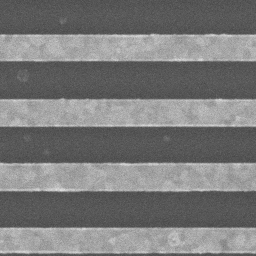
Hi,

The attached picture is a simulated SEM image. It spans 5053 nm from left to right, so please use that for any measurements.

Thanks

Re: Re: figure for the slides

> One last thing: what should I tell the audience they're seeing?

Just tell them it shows lines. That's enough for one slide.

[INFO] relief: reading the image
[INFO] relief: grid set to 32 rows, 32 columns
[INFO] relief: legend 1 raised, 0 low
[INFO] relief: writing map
00000000000000000000000000000000
00000000000000000000000000000000
00000000000000000000000000000000
00000000000000000000000000000000
11111111111111111111111111111111
11111111111111111111111111111111
11111111111111111111111111111111
11111111111111111111111111111111
00000000000000000000000000000000
00000000000000000000000000000000
00000000000000000000000000000000
00000000000000000000000000000000
00000001000000000000000000000000
11111111111111111111111111111111
11111111111111111111111111111111
11111111111111111111111111111111
00000000000000000000000000000000
00000000000000000000000000000000
00000000000000000000000000000000
00000000000000000000000000000000
11111111111111110111111111111111
11111111111111111111111111111111
11111111111111111111111111111111
11111111111111111111111111111111
00000000000000000000000000000000
00000000000000000000000000000000
00000000000000000000000000000000
00000000000000000000000000000000
00000000000000000000000000000000
11111111111111111111111111111111
11111111111111111111111111111111
11111111111111111111111111111111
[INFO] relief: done